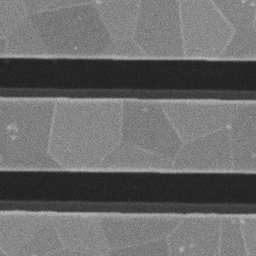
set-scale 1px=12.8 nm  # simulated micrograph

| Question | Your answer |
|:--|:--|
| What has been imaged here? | lines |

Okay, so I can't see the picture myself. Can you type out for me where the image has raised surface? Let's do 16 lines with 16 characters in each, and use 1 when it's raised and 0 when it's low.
1111111111111111
1111111111111111
1111111111111111
1111111111111111
0000000000000000
0000000000000000
1111111111111111
1111111111111111
1111111111111111
1111111111111111
1111111111111111
0000000000000000
0000000000000000
1111111111111111
1111111111111111
1111111111111111